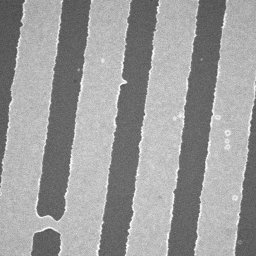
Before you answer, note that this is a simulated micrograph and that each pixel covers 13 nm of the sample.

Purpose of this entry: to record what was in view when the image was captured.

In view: one or a few lines or trenches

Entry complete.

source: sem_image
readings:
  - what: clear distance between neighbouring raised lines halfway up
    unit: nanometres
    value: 363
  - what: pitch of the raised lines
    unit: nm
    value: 875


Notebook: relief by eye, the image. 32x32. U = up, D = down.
DDDUUUUUDDDUUUUUDDDDUUUUUDDDUUUU
DDDUUUUUDDDUUUUUDDDDUUUUUDDDUUUU
DDDUUUUUDDDUUUUUDDDDUUUUUDDDUUUU
DDDUUUUDDDDUUUUUDDDDUUUUDDDDUUUU
DDDUUUUDDDDUUUUUDDDUUUUUDDDDUUUU
DDUUUUUDDDDUUUUUDDDUUUUUDDDDUUUU
DDUUUUUDDDDUUUUDDDDUUUUUDDDDUUUU
DDUUUUUDDDDUUUUDDDDUUUUUDDDUUUUU
DDUUUUUDDDUUUUUDDDDUUUUUDDDUUUUU
DDUUUUUDDDUUUUUDDDDUUUUUDDDUUUUU
DDUUUUDDDDUUUUUDDDDUUUUDDDDUUUUU
DUUUUUDDDDUUUUUDDDUUUUUDDDDUUUUU
DUUUUUDDDDUUUUUDDDUUUUUDDDDUUUUU
DUUUUUDDDDUUUUUDDDUUUUUDDDDUUUUU
DUUUUUDDDDUUUUUDDDUUUUUDDDDUUUUD
DUUUUUDDDUUUUUDDDDUUUUUDDDUUUUUD
DUUUUUDDDUUUUUDDDDUUUUUDDDUUUUUD
DUUUUUDDDUUUUUDDDDUUUUUDDDUUUUUD
DUUUUUDDDUUUUUDDDUUUUUUDDDUUUUUD
DUUUUDDDDUUUUUDDDUUUUUDDDDUUUUUD
UUUUUDDDDUUUUUDDDUUUUUDDDDUUUUUD
UUUUUDDDDUUUUUDDDUUUUUDDDDUUUUUD
UUUUUDDDDUUUUUDDDUUUUUDDDUUUUUDD
UUUUUDDDUUUUUDDDDUUUUUDDDUUUUUDD
UUUUUDDDUUUUUDDDDUUUUUDDDUUUUUDD
UUUUUDDDUUUUUDDDDUUUUUDDDUUUUUDD
UUUUUDDDUUUUUDDDDUUUUUDDDUUUUUDD
UUUUUUUUUUUUUDDDUUUUUDDDDUUUUUDD
UUUUUUUUUUUUUDDDUUUUUDDDDUUUUUDD
UUUUDDDDUUUUUDDDUUUUUDDDDUUUUUDD
UUUUDDDDUUUUDDDDUUUUUDDDUUUUUDDD
UUUUDDDUUUUUDDDDUUUUUDDDUUUUUDDD